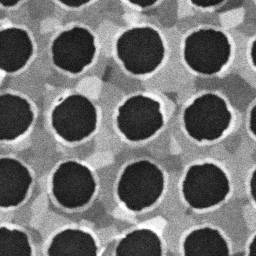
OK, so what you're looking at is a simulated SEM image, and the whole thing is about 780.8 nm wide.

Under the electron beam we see a regular array of holes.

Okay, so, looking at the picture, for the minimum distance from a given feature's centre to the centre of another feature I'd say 66.8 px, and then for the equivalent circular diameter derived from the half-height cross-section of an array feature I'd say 142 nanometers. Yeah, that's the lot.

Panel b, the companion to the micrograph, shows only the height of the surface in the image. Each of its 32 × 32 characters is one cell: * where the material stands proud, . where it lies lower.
..******...******..*****...*****
********************************
********************************
*.*******.******...*************
....***.....***.....****....****
....***.....***.....***......**.
....**......***......**......**.
....***.....***.....***......***
...****...******....****....****
********************************
********************************
********************************
...*****...*****...*****....****
....***.....***.....***.....***.
....**......***.....***......**.
....**......***.....***......**.
...****.....***....****.....***.
*.******..******..**************
********************************
********************************
...*****..******...******..*****
....***....****.....***.....****
....**......***......**......**.
....**......***.....***......**.
...****.....***.....***.....***.
..*****....****....*****...*****
********************************
********************************
.*******************************
...****.....****....***.....****
....**......***.....***.....***.
....**......**......***......**.